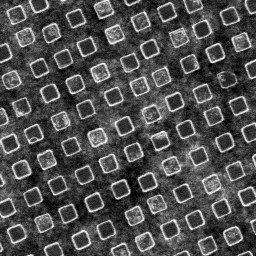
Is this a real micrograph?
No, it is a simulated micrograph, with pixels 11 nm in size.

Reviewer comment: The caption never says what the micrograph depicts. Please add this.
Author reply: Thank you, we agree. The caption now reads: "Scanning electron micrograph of a regular array of raised bodies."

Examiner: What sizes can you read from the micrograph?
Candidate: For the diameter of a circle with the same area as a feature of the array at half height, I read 0.19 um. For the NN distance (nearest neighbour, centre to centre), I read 296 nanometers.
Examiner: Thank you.